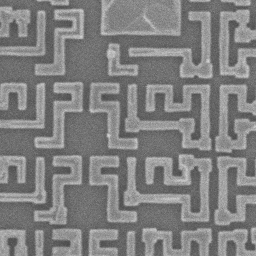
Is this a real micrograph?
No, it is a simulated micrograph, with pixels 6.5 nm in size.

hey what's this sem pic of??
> wiring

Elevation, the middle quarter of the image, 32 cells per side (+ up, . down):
...........+++++++...........+++
...........+++++++...........+++
...........+++++++...........+++
................................
................................
+++++..+++++++..++...++++++...++
++++...+++++++..++...++++++...++
..++...+++......++...++..++...++
..++...++.......++...++..++...++
++++...++++++...++...++..++...++
++++...+++++++..++...++..+++++++
++++...+++++++..++...++..++++++.
...........+++..++..............
...........+++..++..............
...........+++.+++++++++++++++++
...........++..+++++++++++++++++
...........++..++++..........+++
...........++.................++
...........+++................++
...........+++++++............++
...........+++++++............++
................................
................................
++++...++++++...++...+++++...+++
++++...++++++...++...++++++..+++
.+++...++++++...++...++..++..+++
..++...++.......++...+...++..+++
..++...++.......++...+...++...+.
++++...++++++...++...+...+++++++
++++...++++++...++...+...+++++++
...........++...++..............
...........++...++..............